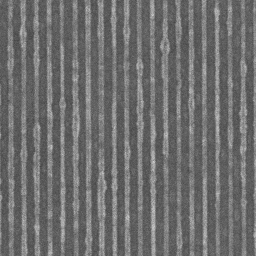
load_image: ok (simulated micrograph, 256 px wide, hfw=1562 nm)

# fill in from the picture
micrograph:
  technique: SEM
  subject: parallel lines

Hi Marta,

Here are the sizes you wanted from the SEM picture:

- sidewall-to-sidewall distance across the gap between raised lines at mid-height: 54.9 nm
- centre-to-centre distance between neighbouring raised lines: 78.8 nanometers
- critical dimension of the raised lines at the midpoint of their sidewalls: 3.38 px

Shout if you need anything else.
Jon